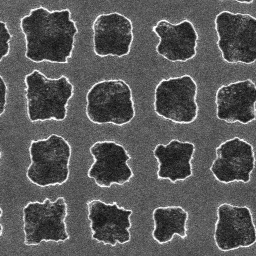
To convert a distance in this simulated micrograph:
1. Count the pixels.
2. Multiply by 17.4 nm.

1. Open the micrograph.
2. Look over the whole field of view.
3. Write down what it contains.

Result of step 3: a regular array of raised bodies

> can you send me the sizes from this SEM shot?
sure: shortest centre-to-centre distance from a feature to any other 60.2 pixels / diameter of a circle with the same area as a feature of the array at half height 43.7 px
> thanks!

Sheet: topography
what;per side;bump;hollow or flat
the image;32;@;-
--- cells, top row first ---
--------------------------------
----@@@@------------------------
---@@@@@@---@@@@-----------@@@@@
@--@@@@@@@--@@@@---@@@@@---@@@@@
@--@@@@@@---@@@@@---@@@@@--@@@@@
@--@@@@@@---@@@@----@@@@---@@@@@
@--@@@@@@---@@@@----@@@@----@@@@
----@@@@-------------@@-----@@@@
--------------------------------
----@@--------------------------
@--@@@@@@---@@@@----@@@@-----@@@
@--@@@@@@--@@@@@---@@@@@---@@@@@
@--@@@@@@--@@@@@---@@@@@---@@@@@
@--@@@@@---@@@@@@--@@@@@@--@@@@@
----@@@@---@@@@@@---@@@@---@@@@@
--------------------------------
--------------------------------
-----@@@---------------------@--
----@@@@@--@@@@----@@@@@---@@@@-
----@@@@@---@@@@---@@@@@---@@@@@
----@@@@@---@@@@----@@@@---@@@@@
---@@@@@@--@@@@@----@@@@---@@@@-
----@@@@----@@@@-----@-----@@@@-
--------------------------------
--------------------------------
----@@@@---@@@------------------
---@@@@----@@@@@---@@@@----@@@@-
---@@@@@---@@@@@---@@@@----@@@@-
---@@@@@---@@@@@---@@@@----@@@@@
---@@@@@----@@@@---@@@-----@@@@@
---@@----------------------@@@@@
--------------------------------